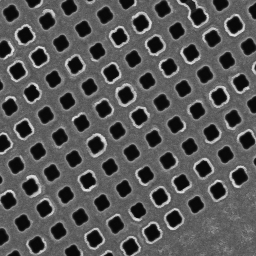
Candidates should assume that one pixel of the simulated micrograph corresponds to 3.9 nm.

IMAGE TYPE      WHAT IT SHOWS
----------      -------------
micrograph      a regular array of holes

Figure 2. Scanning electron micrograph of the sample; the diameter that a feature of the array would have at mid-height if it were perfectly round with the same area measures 55.3 nanometers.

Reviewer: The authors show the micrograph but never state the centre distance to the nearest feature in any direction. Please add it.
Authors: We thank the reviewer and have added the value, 101 nm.